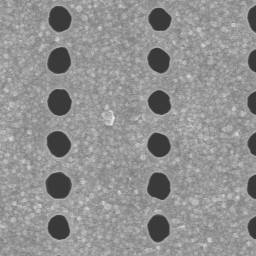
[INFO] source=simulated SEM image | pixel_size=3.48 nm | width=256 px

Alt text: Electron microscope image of a regular array of holes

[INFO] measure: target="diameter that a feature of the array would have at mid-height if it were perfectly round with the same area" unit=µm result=0.0832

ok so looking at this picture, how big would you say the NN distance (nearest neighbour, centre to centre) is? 0.144 micrometres